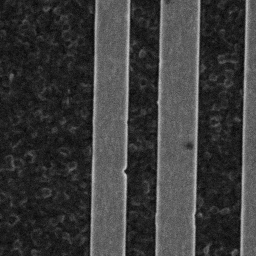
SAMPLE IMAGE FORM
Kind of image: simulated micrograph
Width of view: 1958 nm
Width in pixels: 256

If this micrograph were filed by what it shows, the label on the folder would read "one or a few lines or trenches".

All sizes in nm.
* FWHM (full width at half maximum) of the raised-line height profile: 282